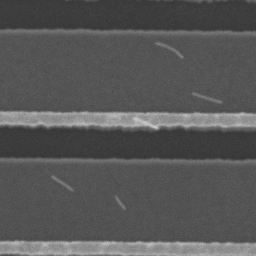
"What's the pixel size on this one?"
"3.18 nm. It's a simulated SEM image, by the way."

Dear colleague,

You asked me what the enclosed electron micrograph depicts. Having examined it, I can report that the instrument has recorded lines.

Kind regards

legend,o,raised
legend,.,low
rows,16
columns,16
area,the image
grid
................
................
oooooooooooooooo
oooooooooooooooo
oooooooooooooooo
oooooooooooooooo
oooooooooooooooo
oooooooooooooooo
................
................
oooooooooooooooo
oooooooooooooooo
oooooooooooooooo
oooooooooooooooo
oooooooooooooooo
oooooooooooooooo